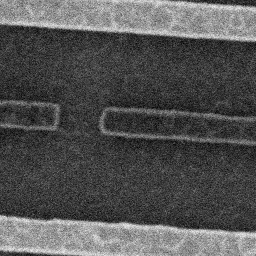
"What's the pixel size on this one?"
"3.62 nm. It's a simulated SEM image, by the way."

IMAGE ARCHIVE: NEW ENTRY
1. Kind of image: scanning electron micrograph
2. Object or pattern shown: one or a few lines or trenches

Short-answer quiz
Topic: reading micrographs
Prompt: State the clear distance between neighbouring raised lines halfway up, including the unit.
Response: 310 nm